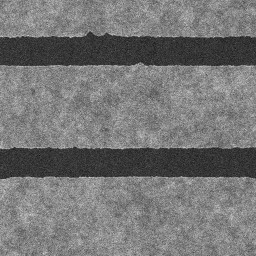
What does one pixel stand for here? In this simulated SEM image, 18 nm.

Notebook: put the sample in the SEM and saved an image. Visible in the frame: one or a few lines or trenches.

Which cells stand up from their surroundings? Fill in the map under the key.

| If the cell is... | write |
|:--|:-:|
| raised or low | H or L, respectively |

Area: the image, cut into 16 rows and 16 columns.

HHHHHHHHHHHHHHHH
HHHHHHHHHHHHHHHH
LLLLLLLLLLLLLLLL
LLLLLLLLLLLLLLLL
HHHHHHHHHHHHHHHH
HHHHHHHHHHHHHHHH
HHHHHHHHHHHHHHHH
HHHHHHHHHHHHHHHH
HHHHHHHHHHHHHHHH
LLLLLLLLLLLLLLLL
LLLLLLLLLLLLLLLL
HHHHHHHHHHHHHHHH
HHHHHHHHHHHHHHHH
HHHHHHHHHHHHHHHH
HHHHHHHHHHHHHHHH
HHHHHHHHHHHHHHHH